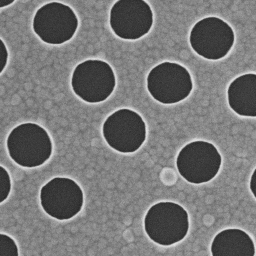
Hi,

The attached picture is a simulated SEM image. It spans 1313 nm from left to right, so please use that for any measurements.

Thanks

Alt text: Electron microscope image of a regular array of holes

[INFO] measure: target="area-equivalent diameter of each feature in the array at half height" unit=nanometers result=221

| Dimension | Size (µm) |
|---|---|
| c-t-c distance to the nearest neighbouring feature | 0.319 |